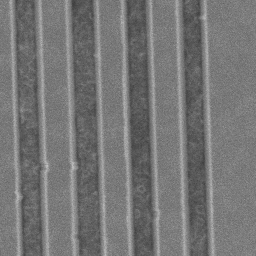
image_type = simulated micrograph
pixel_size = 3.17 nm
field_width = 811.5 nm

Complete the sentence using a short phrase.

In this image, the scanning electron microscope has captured parallel lines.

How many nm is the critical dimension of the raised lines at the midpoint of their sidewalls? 96.3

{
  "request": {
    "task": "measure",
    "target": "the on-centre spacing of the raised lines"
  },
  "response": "55.4 pixels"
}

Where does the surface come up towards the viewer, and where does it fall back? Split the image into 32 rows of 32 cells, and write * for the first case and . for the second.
**...***....***....***...*******
**...****...***....***...*******
**...****...****...***...*******
**...****...****...***...*******
**...****...****...***....******
**...****...****...***....******
**...****...****...****...******
**...****...****...****...******
**...****...****...****...******
**...****...****...****...******
**...****...****...****...******
**...****...****...****...******
**...****...****...****...******
**...****...****...****...******
**...****...****...****...******
**...****...****...****...******
**...****....***...****...******
**...****....***...****...******
**...****....***...****...******
**...****....***...****...******
**...****....***...****...******
**...****....***...****...******
**...****....***...****...******
**...****....***...****...******
**....***....***...****...******
**....***....***...****...******
**....***....***...****...******
**....***....***...****...******
**....***....***...****...******
***...***....***....***...******
***...***....***....***...******
***...***....***....***...******